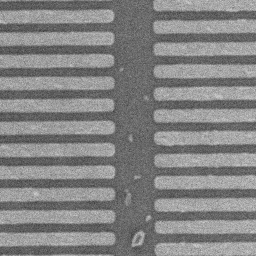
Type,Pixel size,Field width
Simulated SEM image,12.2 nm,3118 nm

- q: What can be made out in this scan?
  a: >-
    groups of lines, slits or small figures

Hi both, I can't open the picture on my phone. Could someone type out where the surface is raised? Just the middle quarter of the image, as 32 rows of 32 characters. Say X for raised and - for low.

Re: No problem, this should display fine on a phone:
XXXXXXXXXXXX-----------XXXXXXX--
-----------------------XXXXXXXXX
-----------------------XXXXXXXXX
XXXXXXXXXXXX--------------------
XXXXXXXXXXXX--------------------
XXXXXXXXXXXX--------------------
-----------------------XXXXXXXXX
-----------------------XXXXXXXXX
-----------------------XXXXXXXXX
XXXXXXXXXXXX--------------------
XXXXXXXXXXXX--------------------
XXXXXXXXXXXX--------------------
-----------------------XXXXXXXXX
-----------------------XXXXXXXXX
XXXX-----XXX--------------------
XXXXXXXXXXXXX-------------------
XXXXXXXXXXXXX-------------------
-----------------------XXXXXXXXX
----------------X------XXXXXXXXX
-----------------------XXXXXXXXX
XXXXXXXXXXXX--------------------
XXXXXXXXXXXX--------------------
XXXXXXXXXXXX--------------------
-----------------------XXXXXXXXX
-----------------------XXXXXXXXX
-----------------------XXXXXXX--
XXXXXXXXXXXX--------------------
XXXXXXXXXXXX--------------------
-----------------------XX-XXXXXX
-----------------------XXXXXXXXX
-----------------------XXXXXXXXX
XXXXXXXXXXXX--------------------